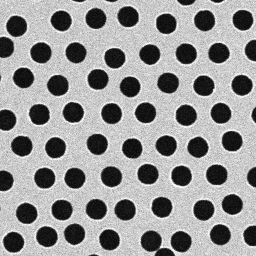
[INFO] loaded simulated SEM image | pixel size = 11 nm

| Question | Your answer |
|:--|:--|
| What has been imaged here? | a regular array of holes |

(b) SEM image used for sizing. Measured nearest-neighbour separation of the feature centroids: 0.352 microns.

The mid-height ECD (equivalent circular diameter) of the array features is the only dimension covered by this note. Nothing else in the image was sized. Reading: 234 nanometers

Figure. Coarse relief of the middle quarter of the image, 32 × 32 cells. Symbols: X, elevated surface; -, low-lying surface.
XXXXXXXXXXX---XXXXXXXXXXXXXXXXXX
XXXXXXXX-XXXXXXXXXXXXXXXXXXXXXXX
XXXXXX-----XXXXXXXXXXXXXX--XXXXX
XXXXXX-----XXXX---XXXXXX-----XXX
-XXXXX-----XXX-----XXXX------XXX
-XXXXX-----XXX-----XXXX------XXX
-XXXXXXX-XXXXX-----XXXXX----XXXX
XXXXXXXXXXXXXXX---XXXXXXXXXXXXXX
XXXXXXXXXXXXXXXXXXXXXXXXXXXXXXXX
XX-XXXXXXXXXXXXXXXXX-XXXXXXXXXXX
----XXXXXX----XXXX----XXXXXXX---
-----XXXX-----XXXX-----XXXXX----
-----XXXX------XXX-----XXXXX----
-----XXXX-----XXXX-----XXXXX----
X---XXXXXX----XXXXX---XXXXXX----
XXXXXXXXXXXXXXXXXXXXXXXXXXXXXX-X
XXXXXXXXXXXXXXXXXXXXXXXXXXXXXXXX
XXXXXXX--XXXXXXXXXXXXXXXXXXXXXXX
XXXXXX-----XXXXX--XXXXXX---XXXXX
XXXXXX-----XXXX----XXXX-----XXX-
XXXXXX-----XXX------XXX-----XXX-
XXXXXX-----XXX------XXX-----XXX-
XXXXXXX--XXXXXX----XXXXX---XXXX-
XXXXXXXXXXXXXXXX--XXXXXXXXXXXXXX
XXXXXXXXXXXXXXXXXXXXXXXXXXXXXXXX
XXXXXXXXXXX-XXXXXXX----XXXXX--XX
X---XXXXXX----XXXX------XXX-----
-----XXXX-----XXXX------XXX-----
------XXX------XXX------XXX-----
-----XXXXX----XXXXX----XXXX-----
X----XXXXXX--XXXXXXXXXXXXXXXX-XX
XXXXXXXXXXXXXXXXXXXXXXXXXXXXXXXX